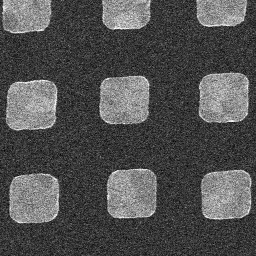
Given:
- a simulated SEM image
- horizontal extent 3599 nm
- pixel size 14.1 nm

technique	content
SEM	raised bodies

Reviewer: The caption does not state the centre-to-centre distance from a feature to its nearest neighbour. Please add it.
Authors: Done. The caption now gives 1320 nm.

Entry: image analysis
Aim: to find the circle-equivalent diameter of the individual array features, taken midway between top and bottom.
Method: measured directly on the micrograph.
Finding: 745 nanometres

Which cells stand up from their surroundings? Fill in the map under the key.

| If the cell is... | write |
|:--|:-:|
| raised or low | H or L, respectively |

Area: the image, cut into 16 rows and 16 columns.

HHHLLLHHHLLLHHHL
HHHLLLLHHLLLLHHL
LLLLLLLLLLLLLLLL
LLLLLLLLLLLLLLLL
LLLLLLLLLLLLLLLL
LHHLLLHHHLLLLHHL
HHHLLLHHHLLLHHHL
HHHLLLLHHLLLLHHL
LLLLLLLLLLLLLLLL
LLLLLLLLLLLLLLLL
LLLLLLLLLLLLLLLL
LHHHLLLHHHLLLHHH
LHHHLLLHHHLLLHHH
LHHLLLLHHLLLLHHL
LLLLLLLLLLLLLLLL
LLLLLLLLLLLLLLLL